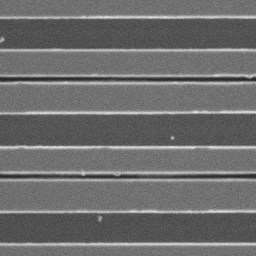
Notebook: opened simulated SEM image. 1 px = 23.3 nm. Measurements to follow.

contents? lines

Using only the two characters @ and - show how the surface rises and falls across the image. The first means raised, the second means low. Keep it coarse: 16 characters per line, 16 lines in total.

@@@@@@@@@@@@@@@@
----------------
----------------
@@@@@@@@@@@@@@@@
@@@@@@@@@@@@@@@@
@@@@@@@@@@@@@@@@
@@@@@@@@@@@@@@@@
----------------
----------------
@@@@@@@@@@@@@@@@
@@@@@@@@@@@@@@@@
@@@@@@@@@@@@@@@@
@@@@@@@@@@@@@@@@
----------------
----------------
@@@@@@@@@@@@@@@@